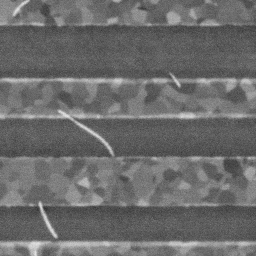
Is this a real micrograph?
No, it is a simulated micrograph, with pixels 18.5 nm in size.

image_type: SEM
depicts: lines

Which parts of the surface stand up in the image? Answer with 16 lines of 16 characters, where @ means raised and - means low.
@@@@@@@@@@@@@@@@
@@@@@@@@@@@@@@@@
----------------
----------------
----------------
@@@@@@@@@@@@@@@@
@@@@@@@@@@@@@@@@
----------------
----------------
----------------
@@@@@@@@@@@@@@@@
@@@@@@@@@@@@@@@@
@@@@@@@@@@@@@@@@
----------------
----------------
@@@@@@@@@@@@@@@@